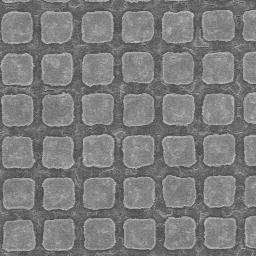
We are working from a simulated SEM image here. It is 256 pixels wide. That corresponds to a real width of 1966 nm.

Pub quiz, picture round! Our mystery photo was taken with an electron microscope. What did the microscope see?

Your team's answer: a regular array of raised bodies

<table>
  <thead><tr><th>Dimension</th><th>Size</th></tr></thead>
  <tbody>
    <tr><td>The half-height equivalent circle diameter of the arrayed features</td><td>263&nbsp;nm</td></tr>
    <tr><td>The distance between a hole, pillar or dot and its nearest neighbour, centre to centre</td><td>308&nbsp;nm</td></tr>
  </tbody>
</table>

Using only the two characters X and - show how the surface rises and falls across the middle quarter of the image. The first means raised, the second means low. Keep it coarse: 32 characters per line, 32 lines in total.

XX---XXXXXXX---XXXXXXX---XXXXXXX
XX--XXXXXXXX---XXXXXXX---XXXXXXX
XX---XXXXXXX---XXXXXXX---XXXXXXX
XX---XXXXXXX---XXXXXXX---XXXXXXX
X----XXXXXXX------XXXX---XXXXXXX
------X-------------------------
--------------------------------
X-----XXXXX---------------------
XX---XXXXXXX---XXXXXXX---XXXXXXX
XX---XXXXXXX---XXXXXXX---XXXXXXX
XX---XXXXXXX---XXXXXXX---XXXXXXX
XX---XXXXXXX---XXXXXXXX--XXXXXXX
XX---XXXXXXX---XXXXXXXX--XXXXXXX
XX---XXXXXXX---XXXXXXX---XXXXXXX
XX---XXXXXXX---XXXXXXX---XXXXXXX
--------------------------------
--------------------------------
--------------------------------
XX---XXXXXXX---XXXXXXX---XXXXXXX
XX---XXXXXXX---XXXXXXX---XXXXXXX
XX---XXXXXXXX--XXXXXXX---XXXXXXX
XX---XXXXXXX---XXXXXXX---XXXXXXX
XX---XXXXXXX---XXXXXXX---XXXXXXX
XX---XXXXXXX---XXXXXXX---XXXXXXX
XXX--XXXXXXX---XXXXXXX---XXXXXXX
XX----X--XXX----XXXX----------XX
--------------------------------
--------------------------------
----------------XXXXXX---XXXX---
XX---XXXXXXXX--XXXXXXXX--XXXXXXX
XX---XXXXXXXX--XXXXXXXX--XXXXXXX
XX---XXXXXXXX--XXXXXXXX--XXXXXXX